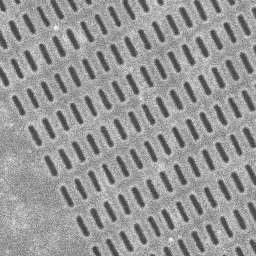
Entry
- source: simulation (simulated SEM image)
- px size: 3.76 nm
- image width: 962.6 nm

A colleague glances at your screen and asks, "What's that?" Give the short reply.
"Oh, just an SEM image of a regular array of holes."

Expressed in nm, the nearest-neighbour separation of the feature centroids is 59.2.